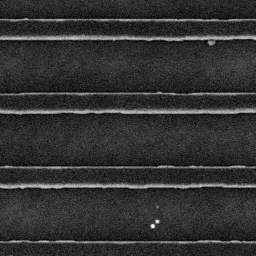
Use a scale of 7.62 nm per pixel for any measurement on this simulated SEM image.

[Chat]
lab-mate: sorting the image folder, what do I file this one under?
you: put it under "lines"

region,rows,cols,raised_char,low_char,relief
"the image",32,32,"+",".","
................................
................................
++++++++++++++++++++++++++++++++
++++++++++++++++++++++++++++++++
++++++++++++++++++++++++++++++++
................................
................................
................................
................................
................................
................................
................................
++++++++++++++++++++++++++++++++
++++++++++++++++++++++++++++++++
................................
................................
................................
................................
................................
................................
................................
++++++++++++++++++++++++++++++++
++++++++++++++++++++++++++++++++
................................
................................
................................
................................
................................
................................
................................
++++++++++++++++++++++++++++++++
++++++++++++++++++++++++++++++++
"